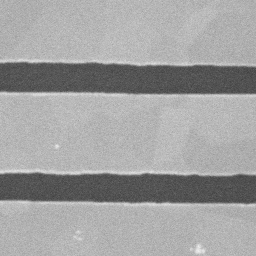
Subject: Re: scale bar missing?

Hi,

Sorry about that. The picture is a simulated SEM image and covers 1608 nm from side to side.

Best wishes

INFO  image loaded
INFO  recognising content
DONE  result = lines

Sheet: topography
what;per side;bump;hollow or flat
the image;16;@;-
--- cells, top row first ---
@@@@@@@@@@@@@@@@
@@@@@@@@@@@@@@@@
@@@@@@@@@@@@@@@@
@@@@@@@@@@@@@@@@
----------------
----------------
@@@@@@@@@@@@@@@@
@@@@@@@@@@@@@@@@
@@@@@@@@@@@@@@@@
@@@@@@@@@@@@@@@@
@@@@@@@@@@@@@@@@
----------------
----------------
@@@@@@@@@@@@@@@@
@@@@@@@@@@@@@@@@
@@@@@@@@@@@@@@@@